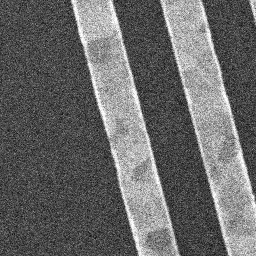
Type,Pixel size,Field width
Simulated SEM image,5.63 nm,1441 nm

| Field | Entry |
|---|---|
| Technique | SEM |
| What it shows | one or a few lines or trenches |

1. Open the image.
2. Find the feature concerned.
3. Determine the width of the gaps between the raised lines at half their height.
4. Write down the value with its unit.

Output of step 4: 276 nanometers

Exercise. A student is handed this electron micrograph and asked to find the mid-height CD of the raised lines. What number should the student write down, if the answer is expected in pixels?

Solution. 37.2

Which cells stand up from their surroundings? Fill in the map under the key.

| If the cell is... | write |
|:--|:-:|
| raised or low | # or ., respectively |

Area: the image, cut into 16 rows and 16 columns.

.....##...###...
.....##....##...
.....###...##...
.....###...##...
......##...###..
......##....##..
......###...##..
.......##...##..
.......##...###.
.......##....##.
.......###...##.
........##...###
........##...###
........##....##
........###...##
.........##...##